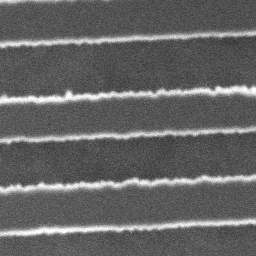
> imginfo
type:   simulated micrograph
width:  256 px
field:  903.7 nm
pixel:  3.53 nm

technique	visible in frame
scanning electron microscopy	lines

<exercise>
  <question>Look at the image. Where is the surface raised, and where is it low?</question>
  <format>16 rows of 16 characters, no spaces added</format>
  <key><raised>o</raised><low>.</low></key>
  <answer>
oooooooooooooooo
oooooooooooooooo
oooooooo........
................
................
................
oooooooooooooooo
oooooooooooooooo
oooooooo........
................
................
.....ooooooooooo
oooooooooooooooo
oooooooooooooooo
ooo.............
................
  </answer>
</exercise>